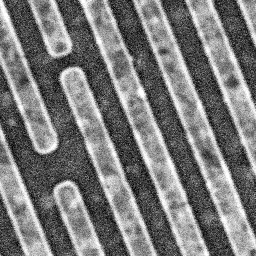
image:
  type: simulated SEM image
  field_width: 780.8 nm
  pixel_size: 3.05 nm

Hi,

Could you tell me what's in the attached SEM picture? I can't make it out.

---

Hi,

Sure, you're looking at parallel lines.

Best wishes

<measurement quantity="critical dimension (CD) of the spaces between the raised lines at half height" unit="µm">0.0844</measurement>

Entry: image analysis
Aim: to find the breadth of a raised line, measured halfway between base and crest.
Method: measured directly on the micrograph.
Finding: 66.6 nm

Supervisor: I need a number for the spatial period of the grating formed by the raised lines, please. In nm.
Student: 149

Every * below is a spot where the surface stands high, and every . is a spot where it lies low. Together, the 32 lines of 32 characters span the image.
....***...***....***....**....**
*...***....***...***....***....*
*....**....***....***...***....*
*....***....***...***....***...*
**...***....***....**....***....
**....***....**....***....**....
***...**.....***...***....***...
***..........***....***...***...
.**...........**....***....***..
.***....**....***....**....***..
.***....***....**....***....**..
..***...***....***....**....***.
..***....***...***....***...***.
...**....***....**....***....***
...***....**....***....***...***
...***....***....**....***....**
....***...***....***...***....**
....***....***...***....***...**
*....**....***....***...***....*
*...........**....***....***...*
**..........***....**....***....
**..........***....***....**....
**...........***...***....***...
***....**....***....***...***...
***....***....**....***....***..
.***...***....***....**....***..
.***....***...***....***....**..
..**....***....***...***....***.
..***....**....***....***...***.
..***....***....**....***....***
...***...***....***...***....***
...***....***...***....***...***